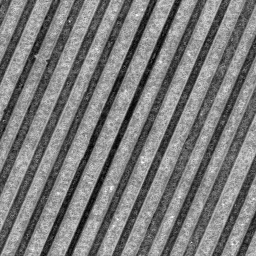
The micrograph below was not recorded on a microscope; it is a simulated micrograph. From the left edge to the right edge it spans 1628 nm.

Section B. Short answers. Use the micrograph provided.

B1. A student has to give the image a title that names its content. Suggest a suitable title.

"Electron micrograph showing parallel lines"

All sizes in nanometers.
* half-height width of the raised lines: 84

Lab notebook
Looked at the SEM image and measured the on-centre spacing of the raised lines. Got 0.143 micrometres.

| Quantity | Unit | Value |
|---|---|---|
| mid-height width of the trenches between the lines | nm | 61.3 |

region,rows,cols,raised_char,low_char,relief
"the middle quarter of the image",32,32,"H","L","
HHLLLHHHLLHHHHLLHHHHHLLHHHLLLHHH
HLLLHHHLLLHHHHLLHHHHLLHHHHLLHHHH
HLLLHHHLLLHHHLLHHHHHLLHHHLLLHHHL
LLLHHHLLLHHHHLLHHHHLLHHHHLLHHHHL
LLLHHHLLLHHHHLLHHHHLLHHHLLLHHHHL
LLLHHHLLHHHHLLHHHHLLHHHHLLLHHHLL
LLHHHLLLHHHHLLHHHHLLHHHLLLHHHHLL
LLHHHLLHHHHLLHHHHLLHHHHLLLHHHLLL
LHHHLLLHHHHLLHHHHLLHHHHLLHHHHLLH
LHHHLLLHHHLLHHHHHLLHHHLLLHHHLLLH
HHHLLLHHHHLLHHHHLLHHHHLLHHHHLLHH
HHHLLLHHHHLLHHHHLLHHHLLLHHHHLLHH
HHHLLHHHHLLHHHHLLHHHHLLLHHHLLLHH
HHLLLHHHHLLHHHHLLHHHLLLHHHHLLHHH
HHLLHHHHLLHHHHLLHHHHLLLHHHLLLHHH
HLLLHHHHLLHHHHLLHHHHLLHHHHLLHHHH
HLLLHHHLLHHHHHLLHHHLLLHHHLLLHHHL
LLLHHHHLLHHHHLLHHHHLLHHHHLLHHHHL
LLLHHHHLLHHHHLLHHHLLLHHHHLLHHHHL
LLHHHHLLHHHHLLHHHHLLLHHHLLLHHHLL
LLHHHHLLHHHHLLHHHLLLHHHHLLHHHHLL
LHHHHLLHHHHLLHHHHLLLHHHLLLHHHLLL
LHHHHLLHHHHLLHHHHLLHHHHLLHHHHLLL
LHHHLLHHHHHLLHHHLLLHHHLLLHHHLLLL
HHHHLLHHHHLLHHHHLLHHHHLLHHHHLLLH
HHHLLHHHHHLLHHHLLLHHHHLLHHHHLLLH
HHHLLHHHHLLHHHHLLLHHHLLLHHHLLLHH
HHHLLHHHHLLHHHLLLHHHHLLHHHHLLLHH
HHLLHHHHLLHHHHLLLHHHLLLHHHLLLHHH
HHLLHHHHLLHHHHLLHHHHLLHHHHLLLHHH
HLLHHHHHLLHHHLLLHHHLLLHHHLLLLHHL
HLLHHHHLLHHHHLLHHHHLLHHHHLLLHHHL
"